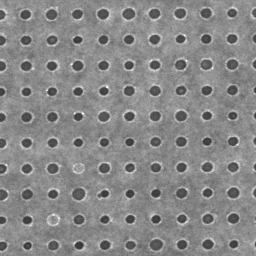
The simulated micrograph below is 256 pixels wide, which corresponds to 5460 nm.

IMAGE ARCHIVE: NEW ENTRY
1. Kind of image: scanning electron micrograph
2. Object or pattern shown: a regular array of holes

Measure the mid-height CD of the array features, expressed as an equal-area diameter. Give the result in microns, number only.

0.228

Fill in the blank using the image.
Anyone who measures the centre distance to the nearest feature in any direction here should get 0.545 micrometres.